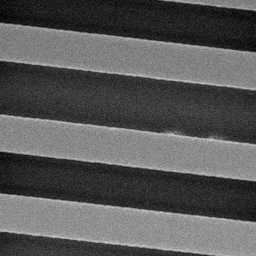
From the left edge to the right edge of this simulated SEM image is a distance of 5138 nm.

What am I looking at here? lines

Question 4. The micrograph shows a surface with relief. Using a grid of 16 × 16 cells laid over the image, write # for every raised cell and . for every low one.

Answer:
...............#
................
#########.......
################
......##########
...............#
................
###.............
###########.....
################
.........#######
................
###.............
############....
################
..........######